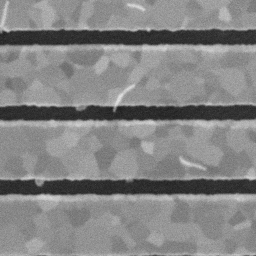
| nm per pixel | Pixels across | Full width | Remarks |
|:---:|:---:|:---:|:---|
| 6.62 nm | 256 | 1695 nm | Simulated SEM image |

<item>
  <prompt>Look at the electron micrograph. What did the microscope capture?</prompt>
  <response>lines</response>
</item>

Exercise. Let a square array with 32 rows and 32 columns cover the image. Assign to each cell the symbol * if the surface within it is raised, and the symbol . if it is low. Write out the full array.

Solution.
********************************
********************************
********************************
********************************
................................
................................
********************************
********************************
********************************
********************************
********************************
********************************
********************************
................................
................................
********************************
********************************
********************************
********************************
********************************
********************************
********************************
................................
................................
.******..***..******************
********************************
********************************
********************************
********************************
********************************
********************************
********************************